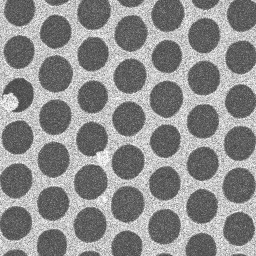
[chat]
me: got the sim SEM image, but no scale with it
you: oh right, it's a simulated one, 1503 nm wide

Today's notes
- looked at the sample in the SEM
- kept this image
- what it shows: a regular array of holes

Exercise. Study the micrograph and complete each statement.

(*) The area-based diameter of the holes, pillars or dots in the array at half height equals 0.199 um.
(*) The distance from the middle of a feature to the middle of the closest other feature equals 248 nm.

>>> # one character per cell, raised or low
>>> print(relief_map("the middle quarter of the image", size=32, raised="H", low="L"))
LLHHLLLLLLHHHLLLLLLLHHLLLLLLLHHH
LLHHHLLLLHHHHLLLLLLLHHHLLLLLHHHL
LLHHHHHHHHHHLLLLLLLLLHHHHHHHHHHL
LLHHHHHHHHHHLLLLLLLLLHHHHHHHHHHL
LLHHHHLLLHHHHLLLLLLLHHHHLLLLHHHL
LHHHLLLLLLHHHLLLLLLLHHHLLLLLLHHL
HHHHLLLLLLLHHHLLLLLHHHLLLLLLLHHH
HHHLLLLLLLLHHHHHHHHHHHLLLLLLLLHH
HHHLLLLLLLLHHHHHHHHHHLLLLLLLLLHH
HHHLLLLLLLLHHHHLLHHHHLLLLLLLLLHH
LHHHLLLLLLHHHLLLLLLHHHLLLLLLLHHH
LLHHHLLLLHHHHLLLLLLLHHLLLLLLLHHH
LLHHHHHHHHHHLLLLLLLLHHHLLLLLHHHL
LLHHHHHHHHHHLLLLLLLLHHHHHLHHHHHL
LLHHHHLHHHHHLLLLLLLLHHHHHHHHHHHL
LHHHLLLLLLHHLLLLLLLLHHHHLLLLHHHL
LHHHLLLLLLHHHLLLLLLHHHHLLLLLHHHL
HHHLLLLLLLLHHHLLLLHHHHLLLLLLLHHH
HHHLLLLLLLLHHHHHHHHHHHLLLLLLLHHH
HHHLLLLLLLLHHHHHHHHHHLLLLLLLLHHH
HHHLLLLLLLLHHHLLLLHHHHLLLLLLLHHH
LHHHLLLLLLHHHLLLLLLHHHLLLLLLLHHH
LHHHHLLLHHHHLLLLLLLLHHHLLLLLHHHL
LLHHHHHHHHHHLLLLLLLLHHHHHLHHHHHL
LHHHHHHHHHHHLLLLLLLLHHHHHHHHHHHL
LHHHHLLLLHHHLLLLLLLLHHHHHLHHHHHL
LHHHLLLLLLHHLLLLLLLLHHHLLLLLHHHL
HHHLLLLLLLLHHLLLLLLHHHLLLLLLLHHL
HHHLLLLLLLLHHHLLLLHHHLLLLLLLLHHH
HHLLLLLLLLLHHHHHHHHHHLLLLLLLLHHH
HHLLLLLLLLLHHHHLLHHHHLLLLLLLLHHH
HHHLLLLLLLHHHLLLLLLHHHLLLLLLLHHH